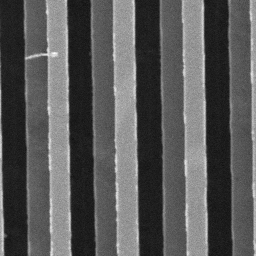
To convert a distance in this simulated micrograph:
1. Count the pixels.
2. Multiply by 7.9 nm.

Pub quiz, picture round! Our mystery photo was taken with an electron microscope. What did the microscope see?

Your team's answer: lines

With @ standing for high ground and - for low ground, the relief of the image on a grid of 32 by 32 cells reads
---@@@@@---@@@@@@---@@@@@----@@@
---@@@@@---@@@@@@---@@@@@----@@@
---@@@@@---@@@@@@---@@@@@----@@@
---@@@@@---@@@@@@---@@@@@----@@@
---@@@@@---@@@@@@---@@@@@----@@@
---@@@@@----@@@@@---@@@@@----@@@
---@@@@@----@@@@@---@@@@@@---@@@
---@@@@@----@@@@@---@@@@@@---@@@
---@@@@@----@@@@@---@@@@@@---@@@
---@@@@@@---@@@@@---@@@@@@---@@@
---@@@@@@---@@@@@---@@@@@@---@@@
---@@@@@@---@@@@@---@@@@@@---@@@
---@@@@@@---@@@@@---@@@@@@---@@@
---@@@@@@---@@@@@---@@@@@@---@@@
---@@@@@@---@@@@@---@@@@@@---@@@
---@@@@@@---@@@@@---@@@@@@---@@@
---@@@@@@---@@@@@---@@@@@@---@@@
---@@@@@@---@@@@@---@@@@@@---@@@
---@@@@@@---@@@@@---@@@@@@---@@@
---@@@@@@---@@@@@---@@@@@@---@@@
---@@@@@@---@@@@@---@@@@@@---@@@
---@@@@@@---@@@@@---@@@@@@---@@@
---@@@@@@---@@@@@---@@@@@@---@@@
---@@@@@@---@@@@@---@@@@@@---@@@
----@@@@@---@@@@@---@@@@@@---@@@
----@@@@@---@@@@@----@@@@@---@@@
----@@@@@---@@@@@---@@@@@@---@@@
----@@@@@---@@@@@---@@@@@@---@@@
----@@@@@---@@@@@---@@@@@@---@@@
----@@@@@---@@@@@----@@@@@---@@@
----@@@@@---@@@@@----@@@@@---@@@
----@@@@@---@@@@@----@@@@@---@@@